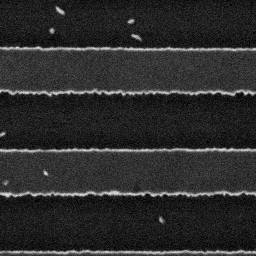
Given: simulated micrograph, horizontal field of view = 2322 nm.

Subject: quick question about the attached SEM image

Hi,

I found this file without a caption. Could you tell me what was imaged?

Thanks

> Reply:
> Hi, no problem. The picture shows lines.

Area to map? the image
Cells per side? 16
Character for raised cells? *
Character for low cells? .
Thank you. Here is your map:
................
................
................
****************
****************
****************
................
................
................
****************
****************
****************
................
................
................
................